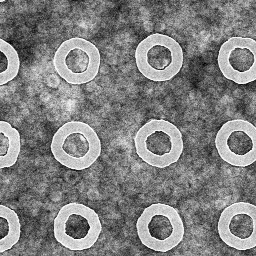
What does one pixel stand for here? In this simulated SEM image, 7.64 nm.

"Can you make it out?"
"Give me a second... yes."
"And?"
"ring-shaped raised bodies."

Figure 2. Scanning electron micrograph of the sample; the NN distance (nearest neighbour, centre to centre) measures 626 nm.